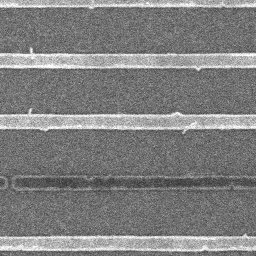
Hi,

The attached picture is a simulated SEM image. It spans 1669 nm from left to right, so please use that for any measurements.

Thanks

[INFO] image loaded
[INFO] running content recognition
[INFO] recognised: parallel lines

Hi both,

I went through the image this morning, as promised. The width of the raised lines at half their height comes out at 82.3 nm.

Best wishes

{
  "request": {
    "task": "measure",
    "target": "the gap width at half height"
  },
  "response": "314 nanometers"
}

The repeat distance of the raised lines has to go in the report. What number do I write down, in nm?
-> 396